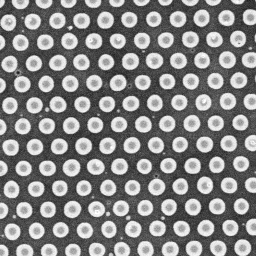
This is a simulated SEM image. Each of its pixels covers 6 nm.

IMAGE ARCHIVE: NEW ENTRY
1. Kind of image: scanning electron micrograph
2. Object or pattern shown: an array of small figures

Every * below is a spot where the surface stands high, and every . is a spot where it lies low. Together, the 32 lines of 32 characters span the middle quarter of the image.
...***...***...***...***...***..
................................
................................
***...***...***...***...***...**
***...***...***...****..****..**
***...***...***...***...***...**
.**....*....**..................
................................
....**....**....**...***...***..
...***...****..****..***...****.
...***...****..****..***...****.
...***....**....**....**........
................................
.*.....*.....**....**....**....*
****..****..****..****..****..**
****..****..****..****..****..**
***...***...***...***....**....*
................................
................**....*.....**..
...****..****..****..****..****.
*..****..****..****..****..****.
*..****..***...****...***...**..
....*...........................
................................
***...***...***....***..****...*
****..****..****..****..****..**
****..****..****...***...***..**
***....**....**.................
................................
....**....**....**....***...***.
*..****..****..****..****..****.
*..****..****..****..****..****.